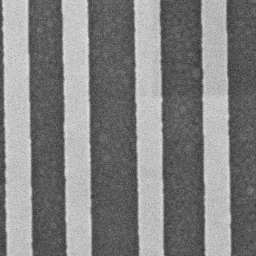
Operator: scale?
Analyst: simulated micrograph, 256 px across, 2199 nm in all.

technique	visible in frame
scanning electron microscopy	lines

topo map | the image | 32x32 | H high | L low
HHHLLLLLHHHLLLLLLHHHLLLLLHHHLLLL
HHHLLLLLHHHLLLLLLHHHLLLLLHHHLLLL
HHHLLLLLHHHLLLLLLHHHLLLLLHHHLLLL
HHHLLLLLHHHLLLLLLHHHLLLLLHHHLLLL
HHHLLLLLHHHLLLLLLHHHLLLLLHHHLLLL
HHHLLLLLHHHLLLLLLHHHLLLLLHHHLLLL
HHHHLLLLHHHLLLLLLHHHLLLLLHHHLLLL
HHHHLLLLHHHLLLLLLHHHLLLLLHHHLLLL
LHHHLLLLHHHLLLLLLHHHLLLLLHHHLLLL
LHHHLLLLHHHLLLLLLHHHLLLLLHHHLLLL
LHHHLLLLHHHLLLLLLHHHLLLLLHHHLLLL
LHHHLLLLHHHLLLLLLHHHLLLLLHHHLLLL
LHHHLLLLHHHLLLLLLHHHLLLLLHHHLLLL
LHHHLLLLHHHLLLLLLHHHLLLLLHHHLLLL
LHHHLLLLHHHLLLLLLHHHLLLLLHHHHLLL
LHHHLLLLHHHLLLLLLHHHLLLLLHHHLLLL
LHHHLLLLHHHLLLLLLHHHLLLLLHHHLLLL
LHHHLLLLHHHLLLLLLHHHLLLLLLHHHLLL
LHHHLLLLHHHLLLLLLHHHLLLLLLHHHLLL
LHHHLLLLHHHLLLLLLHHHLLLLLLHHHLLL
LHHHLLLLHHHLLLLLLHHHLLLLLLHHHLLL
LHHHLLLLHHHLLLLLLHHHLLLLLLHHHLLL
LHHHLLLLHHHLLLLLLHHHLLLLLLHHHLLL
LHHHLLLLHHHLLLLLLHHHLLLLLLHHHLLL
LHHHLLLLHHHLLLLLLHHHLLLLLLHHHLLL
LHHHLLLLHHHLLLLLLHHHLLLLLLHHHLLL
LHHHLLLLHHHLLLLLLHHHLLLLLLHHHLLL
LHHHLLLLHHHLLLLLLHHHLLLLLLHHHLLL
LHHHLLLLHHHLLLLLLHHHLLLLLLHHHLLL
LHHHLLLLHHHLLLLLLHHHLLLLLLHHHLLL
LHHHLLLLHHHLLLLLLHHHLLLLLLHHHLLL
LHHHLLLLHHHLLLLLLHHHLLLLLLHHHLLL